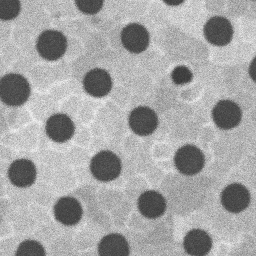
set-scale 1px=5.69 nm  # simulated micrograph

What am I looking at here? a regular array of holes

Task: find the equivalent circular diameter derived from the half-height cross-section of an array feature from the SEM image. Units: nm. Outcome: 174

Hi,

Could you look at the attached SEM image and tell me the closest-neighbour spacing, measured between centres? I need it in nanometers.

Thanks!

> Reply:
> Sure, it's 334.